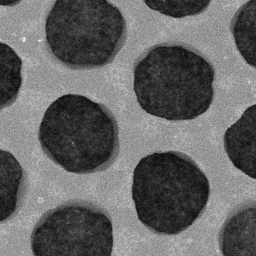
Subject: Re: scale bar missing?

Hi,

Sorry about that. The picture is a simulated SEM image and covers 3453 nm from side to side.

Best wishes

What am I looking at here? holes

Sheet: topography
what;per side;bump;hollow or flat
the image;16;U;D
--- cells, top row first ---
UUUDDDDUUDDDDUUD
UUUDDDDDUUUUUUDD
UUUDDDDDUUUUUUUD
DUUDDDDUUDDDUUUD
DUUUUUUUDDDDDUUU
DUUUUUUUDDDDDUUU
DUUDDDUUUDDDDUUU
UUUDDDDUUUUUUUUD
UUDDDDDUUUUUUUDD
UUUDDDDUUUDUUUDD
DUUUDDUUDDDDUUUD
DUUUUUUUDDDDDUUU
DUUUUUUUDDDDDUUU
DUUDDDDUUDDDUUDD
UUDDDDDUUUDUUUDD
UUDDDDDUUUUUUUDD